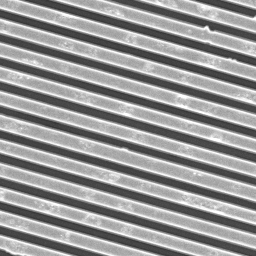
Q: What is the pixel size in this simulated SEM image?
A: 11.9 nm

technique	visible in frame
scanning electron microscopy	parallel lines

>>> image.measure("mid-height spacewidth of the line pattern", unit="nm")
108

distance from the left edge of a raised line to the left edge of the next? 274 nm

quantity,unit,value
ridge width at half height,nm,163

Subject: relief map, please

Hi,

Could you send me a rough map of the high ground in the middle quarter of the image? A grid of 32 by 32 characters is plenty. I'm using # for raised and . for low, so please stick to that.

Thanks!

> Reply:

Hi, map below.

#####........#############......
########.........############...
############........############
...############.........########
......#############........#####
#.........############.........#
#####.........############......
#########........#############..
############.........###########
..##############........########
......#############.........####
#........##############........#
#####........#############......
########.........#############..
############........############
...############.........########
......#############........#####
#.........############.........#
#####........#############......
########.........############...
############........############
..##############........########
......#############.........####
#........##############........#
####.........#############......
########........##############..
###########.........############
..#############........#########
......############.........#####
#.........############.........#
#####........#############......
########.........############...